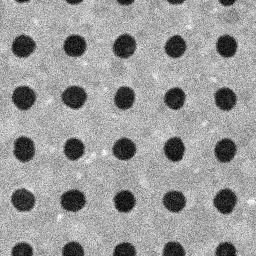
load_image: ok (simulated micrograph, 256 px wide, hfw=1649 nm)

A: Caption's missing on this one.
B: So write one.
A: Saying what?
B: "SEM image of a regular array of holes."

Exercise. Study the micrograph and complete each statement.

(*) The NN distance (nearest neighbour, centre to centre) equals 0.323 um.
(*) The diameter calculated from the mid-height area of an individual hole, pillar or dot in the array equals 157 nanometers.